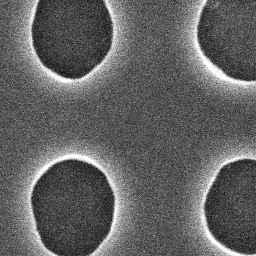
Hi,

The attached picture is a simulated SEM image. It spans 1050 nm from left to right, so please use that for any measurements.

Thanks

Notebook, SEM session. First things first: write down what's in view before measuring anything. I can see holes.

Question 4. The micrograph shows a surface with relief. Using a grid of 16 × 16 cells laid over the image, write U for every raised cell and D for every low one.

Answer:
UUDDDDDUUUUUUDDD
UUDDDDDUUUUUDDDD
UUDDDDDUUUUUDDDD
UUDDDDDUUUUUUDDD
UUUDDDUUUUUUUUDD
UUUUUUUUUUUUUUUU
UUUUUUUUUUUUUUUU
UUUUUUUUUUUUUUUU
UUUUUUUUUUUUUUUU
UUUUUUUUUUUUUUUU
UUUDDDUUUUUUUUDD
UUDDDDDUUUUUUDDD
UUDDDDDUUUUUUDDD
UUDDDDDUUUUUUDDD
UUDDDDDUUUUUUDDD
UUUDDDUUUUUUUUDD